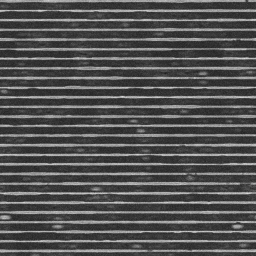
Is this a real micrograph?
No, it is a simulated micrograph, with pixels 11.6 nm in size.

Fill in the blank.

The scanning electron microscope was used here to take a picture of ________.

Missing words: parallel lines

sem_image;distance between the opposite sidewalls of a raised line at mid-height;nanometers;20.2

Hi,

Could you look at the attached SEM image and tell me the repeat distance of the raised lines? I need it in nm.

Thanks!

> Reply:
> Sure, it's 111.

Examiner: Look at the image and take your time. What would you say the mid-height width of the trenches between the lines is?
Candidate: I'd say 0.0926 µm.